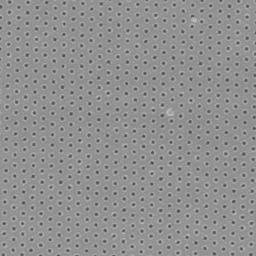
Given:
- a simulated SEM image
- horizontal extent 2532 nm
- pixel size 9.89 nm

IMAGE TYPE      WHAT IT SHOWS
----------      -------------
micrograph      a regular array of holes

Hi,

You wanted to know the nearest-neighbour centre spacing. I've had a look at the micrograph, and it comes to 100 nm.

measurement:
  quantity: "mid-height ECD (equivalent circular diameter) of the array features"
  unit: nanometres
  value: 40.2